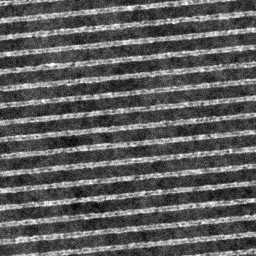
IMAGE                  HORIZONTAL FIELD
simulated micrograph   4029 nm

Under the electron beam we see parallel lines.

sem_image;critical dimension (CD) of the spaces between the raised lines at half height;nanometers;210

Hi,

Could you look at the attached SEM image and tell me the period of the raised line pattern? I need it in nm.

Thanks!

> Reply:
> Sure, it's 266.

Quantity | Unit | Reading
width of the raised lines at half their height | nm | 58.8